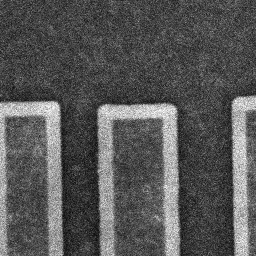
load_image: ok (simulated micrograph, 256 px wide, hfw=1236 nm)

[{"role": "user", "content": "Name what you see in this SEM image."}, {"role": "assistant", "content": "one or a few lines or trenches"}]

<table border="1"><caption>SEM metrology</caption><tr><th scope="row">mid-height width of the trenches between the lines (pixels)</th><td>62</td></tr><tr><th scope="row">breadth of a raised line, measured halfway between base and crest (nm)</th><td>302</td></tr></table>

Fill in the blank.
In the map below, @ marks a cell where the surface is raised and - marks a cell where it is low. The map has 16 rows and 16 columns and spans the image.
----------------
----------------
----------------
----------------
----------------
----------------
----------------
@@@----@@@@----@
@@@----@@@@----@
@@@----@@@@----@
@@@----@@@@----@
@@@----@@@@----@
@@@----@@@@----@
@@@----@@@@----@
@@@----@@@@----@
@@@----@@@@----@